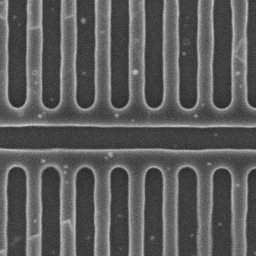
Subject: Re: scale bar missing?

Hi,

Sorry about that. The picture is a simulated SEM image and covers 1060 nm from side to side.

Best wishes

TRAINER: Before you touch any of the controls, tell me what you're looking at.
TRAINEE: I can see groups of lines, slits or small figures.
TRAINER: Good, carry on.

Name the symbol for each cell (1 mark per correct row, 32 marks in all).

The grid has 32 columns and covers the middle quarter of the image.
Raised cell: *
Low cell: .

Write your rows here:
***.....***.....****.....***....
***.....***.....****.....***....
***.....***.....****.....***....
***.....***.....****.....***....
***.....***.....****.....***....
***.....***.....****.....***....
***.....***......***.....***....
***.....***......***.....***....
***.....***......***.....***....
***.....****....****.....****...
***....*****....*****...*****...
******************************.*
********************************
********************************
********************************
................................
................................
................................
................................
................................
................................
...............**********.......
********************************
********************************
********************************
******************************.*
****...*****...******...*****...
***....****.....****.....***....
***.....***.....****.....***....
***.....***.....****.....***....
***.....***.....****.....***....
***.....***.....****.....***....